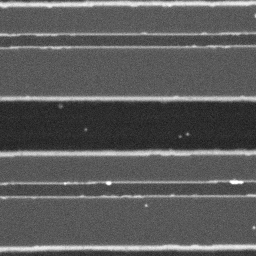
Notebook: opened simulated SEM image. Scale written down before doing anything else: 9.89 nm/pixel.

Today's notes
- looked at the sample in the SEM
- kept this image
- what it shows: lines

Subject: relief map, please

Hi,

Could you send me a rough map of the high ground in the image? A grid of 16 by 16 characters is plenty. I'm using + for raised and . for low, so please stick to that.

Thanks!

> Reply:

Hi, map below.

++++++++++++++++
++++++++++++++++
++++++++++++++++
++++++++++++++++
++++++++++++++++
++++++++++++++++
................
................
................
................
++++++++++++++++
++++++++++++++++
++++++++++++++++
++++++++++++++++
++++++++++++++++
................